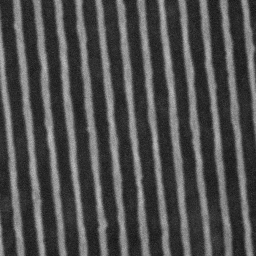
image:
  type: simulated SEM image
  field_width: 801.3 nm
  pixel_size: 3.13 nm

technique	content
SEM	parallel lines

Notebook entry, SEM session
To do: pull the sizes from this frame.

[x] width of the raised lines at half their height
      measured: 15.6 nm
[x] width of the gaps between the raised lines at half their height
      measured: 0.0487 microns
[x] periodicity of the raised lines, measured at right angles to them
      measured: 64.7 nm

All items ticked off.